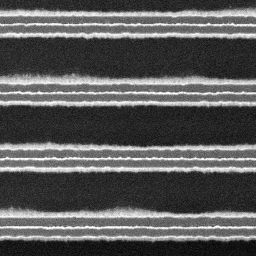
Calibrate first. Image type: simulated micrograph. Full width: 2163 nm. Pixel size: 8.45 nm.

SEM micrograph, lines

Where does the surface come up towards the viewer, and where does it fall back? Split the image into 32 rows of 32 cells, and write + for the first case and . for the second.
................................
................................
++++++++++++++++++++++++++++++++
++++++++++++++++++++++++++++++++
................................
................................
................................
................................
................................
................................
++++++++++++++++++++++++++++++++
++++++++++++++++++++++++++++++++
++++++++++++++++++++++++++++++++
................................
................................
................................
................................
................................
................................
++++++++++++++++++++++++++++++++
++++++++++++++++++++++++++++++++
................................
................................
................................
................................
................................
................................
++++++++++++++++++++++++++++++++
++++++++++++++++++++++++++++++++
++++++++++++++++++++++++++++++++
................................
................................